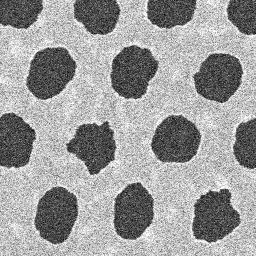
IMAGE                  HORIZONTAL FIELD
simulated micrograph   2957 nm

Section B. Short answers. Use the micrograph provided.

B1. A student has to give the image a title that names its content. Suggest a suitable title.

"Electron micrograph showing a regular array of holes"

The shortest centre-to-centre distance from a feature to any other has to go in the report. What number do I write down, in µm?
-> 0.882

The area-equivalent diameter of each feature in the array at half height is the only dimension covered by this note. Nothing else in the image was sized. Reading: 572 nanometres